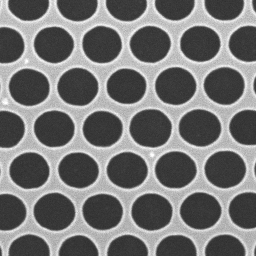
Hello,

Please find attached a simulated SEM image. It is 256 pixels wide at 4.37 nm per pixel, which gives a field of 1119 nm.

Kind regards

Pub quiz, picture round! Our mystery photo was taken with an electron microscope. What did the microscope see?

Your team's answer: a regular array of holes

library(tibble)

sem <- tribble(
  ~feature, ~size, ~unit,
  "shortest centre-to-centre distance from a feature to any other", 210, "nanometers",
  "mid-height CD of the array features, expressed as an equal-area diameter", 170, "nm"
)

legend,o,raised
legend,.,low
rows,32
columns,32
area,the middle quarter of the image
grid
oooooooooooooooooooooooooooooooo
o.....ooooooo....oooooooo......o
.......ooooo.......ooooo........
........ooo.........ooo.........
........ooo..........oo.........
.........oo..........oo.........
.........oo.........ooo.........
........ooo.........ooo.........
........oooo.......ooooo........
.......oooooo.....ooooooo......o
oooo.ooooooooooooooooooooooooooo
oooooooooooooooooooo....oooooooo
.oooooo.....oooooo.......ooooo..
..oooo........ooo.........ooo...
..ooo.........ooo..........oo...
...oo..........o...........oo...
...oo..........o...........oo...
...oo.........ooo..........oo...
..ooo.........ooo.........ooo...
.ooooo.......ooooo........oooo..
oooooooo....ooooooo.....oooooooo
oooooooooooooooooooooooooooooooo
o....oooooooo.....ooooooo......o
.......ooooo........oooo........
........ooo.........ooo.........
.........oo..........oo.........
.........oo..........oo.........
.........oo..........oo.........
........ooo.........ooo.........
........oooo........oooo........
o.....ooooooo......oooooo.....oo
oooooooooooooooooooooooooooooooo